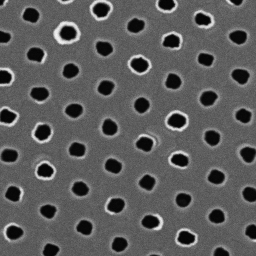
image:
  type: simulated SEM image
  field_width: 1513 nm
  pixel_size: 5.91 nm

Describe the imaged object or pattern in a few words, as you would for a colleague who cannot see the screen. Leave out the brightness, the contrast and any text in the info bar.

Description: a regular array of holes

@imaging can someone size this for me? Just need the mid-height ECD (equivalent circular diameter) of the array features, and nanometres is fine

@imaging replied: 88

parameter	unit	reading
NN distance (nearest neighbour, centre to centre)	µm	0.226